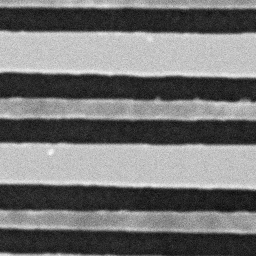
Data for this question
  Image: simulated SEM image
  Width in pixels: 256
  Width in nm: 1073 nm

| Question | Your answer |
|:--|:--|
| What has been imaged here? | lines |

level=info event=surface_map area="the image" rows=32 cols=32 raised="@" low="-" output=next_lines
@@@@@@@@@@@@@@@@@@@@@@@@@@@@@@@@
--------------------------------
--------------------------------
--------------------------------
@@@@@@@@@@@@@@@@@@@@@@@@@@@@@@@@
@@@@@@@@@@@@@@@@@@@@@@@@@@@@@@@@
@@@@@@@@@@@@@@@@@@@@@@@@@@@@@@@@
@@@@@@@@@@@@@@@@@@@@@@@@@@@@@@@@
@@@@@@@@@@@@@@@@@@@@@@@@@@@@@@@@
-----------------@@@---@@@@@@@@@
--------------------------------
--------------------------------
@@@@@@@@------------------------
@@@@@@@@@@@@@@@@@@@@@@@@@@@@@@@@
@@@@@@@@@@@@@@@@@@@@@@@@@@@@@@@@
--------------------------------
--------------------------------
--------------------------------
@@@@@@@@@@@@@@@@@@@@@@@@@@@@@@@@
@@@@@@@@@@@@@@@@@@@@@@@@@@@@@@@@
@@@@@@@@@@@@@@@@@@@@@@@@@@@@@@@@
@@@@@@@@@@@@@@@@@@@@@@@@@@@@@@@@
@@@@@@@@@@@@@@@@@@@@@@@@@@@@@@@@
------------------------@@@-@@@@
--------------------------------
--------------------------------
@@@@@@@@@@--@@@@----------------
@@@@@@@@@@@@@@@@@@@@@@@@@@@@@@@@
--@@@@@@@@@@@@@@@@@@@@@@@@@@@@@@
--------------------------------
--------------------------------
--------------------------------